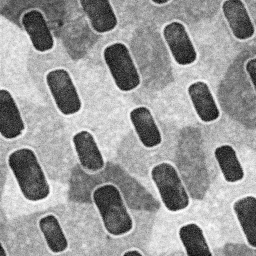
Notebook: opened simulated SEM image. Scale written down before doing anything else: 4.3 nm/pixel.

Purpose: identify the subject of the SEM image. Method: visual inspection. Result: a regular array of holes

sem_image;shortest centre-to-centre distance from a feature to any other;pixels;62.6